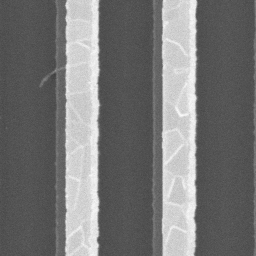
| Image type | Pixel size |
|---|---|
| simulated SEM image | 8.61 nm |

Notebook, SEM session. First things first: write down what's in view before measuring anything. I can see lines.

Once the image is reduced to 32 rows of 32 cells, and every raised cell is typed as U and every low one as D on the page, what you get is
DDDDDDDUUUUUDDDDDDDUUUUUUDDDDDDD
DDDDDDDUUUUUDDDDDDDUUUUUUDDDDDDD
DDDDDDDUUUUUDDDDDDDUUUUUUDDDDDDD
DDDDDDDUUUUUDDDDDDDUUUUUUDDDDDDD
DDDDDDDUUUUUDDDDDDDUUUUUUDDDDDDD
DDDDDDDUUUUUDDDDDDDUUUUUUDDDDDDD
DDDDDDDUUUUUDDDDDDDUUUUUUDDDDDDD
DDDDDDDUUUUUDDDDDDDUUUUUUDDDDDDD
DDDDDDDUUUUUDDDDDDDUUUUUUDDDDDDD
DDDDDDDUUUUUDDDDDDDUUUUUUDDDDDDD
DDDDDDDUUUUUDDDDDDDUUUUUDDDDDDDD
DDDDDDDUUUUUDDDDDDDUUUUUDDDDDDDD
DDDDDDDUUUUUDDDDDDDUUUUUUDDDDDDD
DDDDDDDUUUUUDDDDDDDUUUUUDDDDDDDD
DDDDDDDUUUUUDDDDDDDUUUUUUDDDDDDD
DDDDDDDUUUUUDDDDDDDUUUUUUDDDDDDD
DDDDDDDUUUUUDDDDDDDUUUUUDDDDDDDD
DDDDDDDUUUUUDDDDDDDUUUUUDDDDDDDD
DDDDDDDUUUUUDDDDDDDUUUUUUDDDDDDD
DDDDDDDUUUUUDDDDDDDUUUUUDDDDDDDD
DDDDDDDUUUUUDDDDDDDUUUUUUDDDDDDD
DDDDDDDUUUUUDDDDDDDUUUUUUDDDDDDD
DDDDDDDUUUUUDDDDDDDUUUUUDDDDDDDD
DDDDDDDUUUUUDDDDDDDUUUUUUDDDDDDD
DDDDDDDUUUUUDDDDDDDUUUUUUDDDDDDD
DDDDDDDUUUUUDDDDDDDUUUUUUDDDDDDD
DDDDDDDUUUUUDDDDDDDUUUUUDDDDDDDD
DDDDDDDUUUUUDDDDDDDUUUUUDDDDDDDD
DDDDDDDUUUUUDDDDDDDUUUUUUDDDDDDD
DDDDDDDUUUUUDDDDDDDUUUUUDDDDDDDD
DDDDDDDUUUUUDDDDDDDUUUUUDDDDDDDD
DDDDDDDUUUUUDDDDDDDUUUUUDDDDDDDD